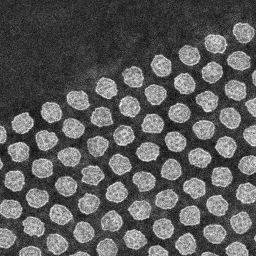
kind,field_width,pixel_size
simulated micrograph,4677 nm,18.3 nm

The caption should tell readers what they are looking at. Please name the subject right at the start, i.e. a regular array of raised bodies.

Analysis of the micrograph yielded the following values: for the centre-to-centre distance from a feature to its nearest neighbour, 520 nm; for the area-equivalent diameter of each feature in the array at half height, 0.362 µm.